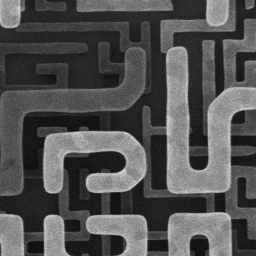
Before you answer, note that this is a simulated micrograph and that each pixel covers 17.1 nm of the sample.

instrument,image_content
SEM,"wiring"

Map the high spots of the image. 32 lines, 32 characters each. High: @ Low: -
@@@-----------------------@@@---
@@@-----------------------@@----
@@@-----------------------@@----
--------------------------------
--------------------------------
--------------------------------
----------------@@---@@---------
----------------@@---@@---------
----------------@@---@@---------
----------------@@---@@---------
---------------@@@---@@---------
-@@@@@@@@@@@@@@@@@---@@-----@@@@
@@@@@@@@@@@@@@@@@----@@----@@@@@
@@@@@@@@@@@@@@@@-----@@@--@@@@@@
@@@------------------@@@--@@@---
@@@------------------@@@--@@@---
@@@-------@@@--------@@@--@@@---
@@@---@@@@@@@@@@@----@@@--@@@---
@@@---@@@@@@@@@@@@---@@@--@@@---
@@@--@@@-------@@@---@@@--@@@---
@@@--@@@--------@@---@@@--@@@---
@@@--@@@-------@@@---@@@@@@@@---
@@@--@@@---@@@@@@@---@@@@@@@@---
@@@---@@---@@@@@@----@@@@@@@@---
--------------------------------
--------------------------------
--------------------------------
@@@---@@---@@@@@@@---@@@@@@@@---
@@@---@@---@@@@@@@---@@@@@@@@---
@@@---@@-------@@@---@@@--@@@---
@@@---@@--------@@---@@@--@@@---
@@@---@@-------@@@---@@@--@@@---